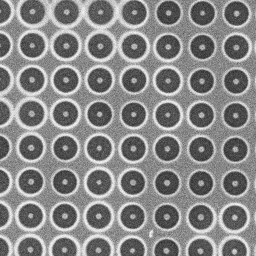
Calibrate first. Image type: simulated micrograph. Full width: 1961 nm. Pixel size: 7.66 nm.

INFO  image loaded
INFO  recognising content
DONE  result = an array of small figures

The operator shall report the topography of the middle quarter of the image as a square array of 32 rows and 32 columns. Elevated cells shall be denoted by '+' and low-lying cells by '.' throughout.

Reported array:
++++++++++++++++++++++++++++++++
...++++....++++.....++++....++++
....++......+++......++......+++
....++......++.......++......+++
....++......++...+...++......++.
....++......+++.....+++......++.
...++++....+++++....++++.....+++
++++++++++++++++++++++++++++++++
++++++++++++++++++++++++++++++++
..++++++..+++++++.++++++++++++++
...+++.....++++.....+++.....++++
....++......++......+++......++.
+...++......++...+...++......++.
....++......++......+++......++.
...+++.....++++.....+++......++.
..+++++...++++++...+++++....++++
++++++++++++++++++++++++++++++++
++++++++++++++++++++++++++++++++
..+++++....++++....+++++....++++
...+++......+++.....+++......+++
....+.......++.......++......++.
....+.......++...+...++......++.
...+++......++......+++......++.
..+++++....++++....+++++....++++
++++++++..+++++++.++++++++++++++
++++++++++++++++++++++++++++++++
.++++++...++++++..++++++++++++++
...+++.....++++.....++++....++++
...+++......++......+++......+++
+...+...+...++...+...++..+...++.
...+++......++......+++......++.
...+++......+++.....+++......+++